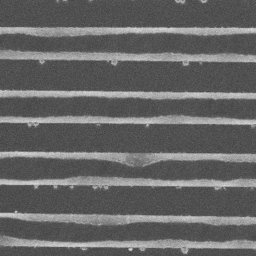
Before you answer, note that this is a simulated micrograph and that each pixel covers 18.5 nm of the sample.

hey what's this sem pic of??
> lines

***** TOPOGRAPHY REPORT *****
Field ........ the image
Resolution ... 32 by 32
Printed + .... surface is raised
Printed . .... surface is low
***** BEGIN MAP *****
................................
................................
................................
................................
++++++++++++++++++++++++++++++++
++++++++++++++++++++++++++++++++
++++++++++++++++++++++++++++++++
................................
................................
................................
................................
................................
++++++++++++++++++++++++++++++++
++++++++++++++++++++++++++++++++
++++++++++++++++++++++++++++++++
................................
................................
................................
................................
++++++++++++++..................
++++++++++++++++++++++++++++++++
++++++++++++++++++++++++++++++++
++++++++++++++++++++++++++++++++
................................
................................
................................
................................
++++++++++++++++++++++++++......
++++++++++++++++++++++++++++++++
++++++++++++++++++++++++++++++++
......++++++++++++++..++++++++++
................................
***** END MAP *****